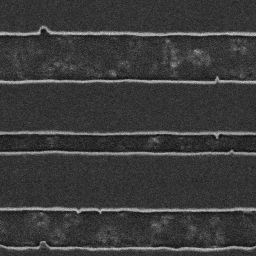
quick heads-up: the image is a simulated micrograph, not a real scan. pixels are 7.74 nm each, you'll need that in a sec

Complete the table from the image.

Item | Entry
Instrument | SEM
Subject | one or a few lines or trenches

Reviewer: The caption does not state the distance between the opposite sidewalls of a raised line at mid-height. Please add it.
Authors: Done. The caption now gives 422 nm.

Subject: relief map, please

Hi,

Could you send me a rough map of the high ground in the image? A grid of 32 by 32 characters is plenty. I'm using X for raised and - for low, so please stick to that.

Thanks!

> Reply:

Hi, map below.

XXXXXXXXXXXXXXXXXXXXXXXXXXXXXXXX
XXXXXXXXXXXXXXXXXXXXXXXXXXXXXXXX
XXXXXXXXXXXXXXXXXXXXXXXXXXXXXXXX
XXXXXXXXXXXXXXXXXXXXXXXXXXXXXXXX
--------------------------------
--------------------------------
--------------------------------
--------------------------------
--------------------------------
--------------------------------
XXXXXXXXXXXXXXXXXXXXXXXXXXXXXXXX
XXXXXXXXXXXXXXXXXXXXXXXXXXXXXXXX
XXXXXXXXXXXXXXXXXXXXXXXXXXXXXXXX
XXXXXXXXXXXXXXXXXXXXXXXXXXXXXXXX
XXXXXXXXXXXXXXXXXXXXXXXXXXXXXXXX
XXXXXXXXXXXXXXXXXXXXXXXXXXXXXXXX
XXX----XXXXXXXXXXXXXXXXXXXXXXXXX
--------------------------------
--------------------------------
XXXXXXXXXXXXXXXXXXXXXXXXXXXXXXXX
XXXXXXXXXXXXXXXXXXXXXXXXXXXXXXXX
XXXXXXXXXXXXXXXXXXXXXXXXXXXXXXXX
XXXXXXXXXXXXXXXXXXXXXXXXXXXXXXXX
XXXXXXXXXXXXXXXXXXXXXXXXXXXXXXXX
XXXXXXXXXXXXXXXXXXXXXXXXXXXXXXXX
XXXXXXXXXXXXXXXXXXXXXXXXXXXXXXXX
--------------------------------
--------------------------------
--------------------------------
--------------------------------
-----X--------------------------
XXXXXXXXXXXXXXXXXXXXXXXXXXXXXXXX